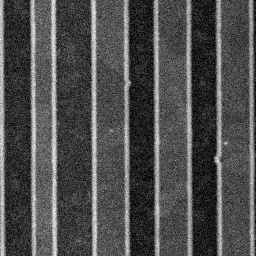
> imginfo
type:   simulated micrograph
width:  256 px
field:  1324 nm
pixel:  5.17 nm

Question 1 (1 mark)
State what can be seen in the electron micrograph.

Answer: parallel lines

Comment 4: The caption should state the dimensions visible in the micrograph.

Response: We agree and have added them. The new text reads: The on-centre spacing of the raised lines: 330 nm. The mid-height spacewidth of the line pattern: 152 nm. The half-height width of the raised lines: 177 nm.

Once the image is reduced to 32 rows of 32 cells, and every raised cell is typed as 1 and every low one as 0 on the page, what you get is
00001110000011110001111100011110
00001110000011110001111100011110
00001110000011110001111100011110
00001110000011110001111100011110
00001110000011110001111100011110
00001110000011110001111100011110
00001110000011110001111100011110
00001110000011110001111100011110
00001110000011110000111100011110
00001110000011110000111100011110
00001110000011110000111100011110
00001110000011110000111100011110
00001110000011110000111100011110
00001110000011110000111100011111
00001110000011110000111100011111
00001110000011110000111100011111
00001110000011110000111100011111
00001110000011110000111100011111
00001110000011110000111100011111
00001110000011110000111100011111
00001110000011110000111100011111
00001110000011110000111100011111
00001110000011110000111100011111
00001110000011110000111100011111
00001110000011110000111100011111
00001110000011110000111100011111
00001110000011110000111100011111
00001110000011110000111100011111
00001110000011110000111100011111
00001110000011110000111100011111
00001110000011110000111100011111
00001110000011110000111100011111